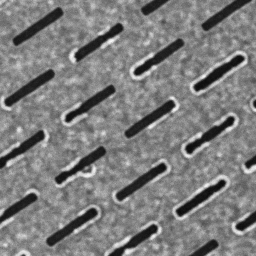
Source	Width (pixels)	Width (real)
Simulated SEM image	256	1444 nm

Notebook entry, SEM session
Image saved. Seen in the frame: a regular array of holes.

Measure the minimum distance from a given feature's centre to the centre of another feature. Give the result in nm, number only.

345